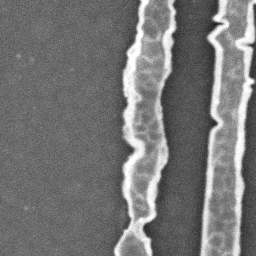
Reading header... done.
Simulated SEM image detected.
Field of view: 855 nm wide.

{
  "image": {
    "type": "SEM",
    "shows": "one or a few lines or trenches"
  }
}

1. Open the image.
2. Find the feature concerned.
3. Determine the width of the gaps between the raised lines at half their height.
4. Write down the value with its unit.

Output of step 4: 168 nanometers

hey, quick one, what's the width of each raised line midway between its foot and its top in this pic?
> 106 nm